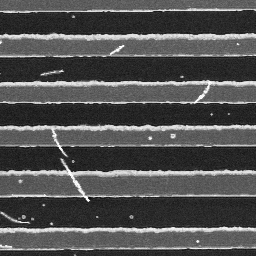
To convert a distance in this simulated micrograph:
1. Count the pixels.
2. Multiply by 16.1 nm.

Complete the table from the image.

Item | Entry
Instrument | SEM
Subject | lines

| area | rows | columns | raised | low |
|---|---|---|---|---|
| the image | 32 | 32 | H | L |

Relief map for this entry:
HHHHHHHHHHHHHHHHHHHHHHHHHHHHHHHH
HHHHHLLLHLLLLLLLLLLLLLLLLLLLLLLL
LLLLLLLLLLLLLLLLLLLLLLLLLLLLLLLL
LLLLLLLLLLLLLLLLLLLLLLLLLLLLLLLL
HHHHHLHHLLLLLLLLHHHHHHHHLHHLHHHH
HHHHHHHHHHHHHHHHHHHHHHHHHHHHHHHH
HHHHHHHHHHHHHHHHHHHHHHHHHHHHHHHH
LLLLLLLLLLLLLLLLLLLLLLLLLLLLLLLL
LLLLLLLLLLLLLLLLLLLLLLLLLLLLLLLL
LLLLLLLLLLLLLLLLLLLLLLLLLLLLLLLL
HHHHHHHHHHHHHHHHHHHHHHHHHHHHHHHH
HHHHHHHHHHHHHHHHHHHHHHHHHHHHHHHH
HHHHHHHHHHHHHHHHHHHHHHHHHHHHHHHH
LLLLLLLLLLLLLLLLLLLLLLLLLLLLLLLL
LLLLLLLLLLLLLLLLLLLLLLLLLLLLLLLL
LLLLLLLLLLLLLLLLLLLLLLLLLLLLLLLL
HHHHHHHHHHHHHHHHHHHHHHHHHHHHHHHH
HHHHHHHHHHHHHHHHHHHHHHHHHHHHHHHH
LLLLLLLLLLLLLLLLLLLLLLLLLLLLLLLL
LLLLLLLLLLLLLLLLLLLLLLLLLLLLLLLL
LLLLLLLLLLLLLLLLLLLLLLLLLLLLLLLL
LHHHHHHHHLLLLLHHHLLHLHLHHHLHHHHH
HHHHHHHHHHHHHHHHHHHHHHHHHHHHHHHH
HHHHHHHHHHHHHHHHHHHHHHHHHHHHHHHH
HHHHHHHHHHHHHHHHHHHHLLLLLLLLLLLL
LLLLLLLLLLLLLLLLLLLLLLLLLLLLLLLL
LLLLLLLLLLLLLLLLLLLLLLLLLLLLLLLL
LLLLLLLLLLLLLLLLLLLLLLLLLLLLLLLL
LLLLLLLLLLLLLLLLLLLLLLLLLLLLLLLL
HHHHHHHHHHHHHHHHHHHHHHHHHHHHHHHH
HHHHHHHHHHHHHHHHHHHHHHHHHHHHHHHH
LLLLLLLLLLLLLLLLLLLLLLLLLLLLLLLL